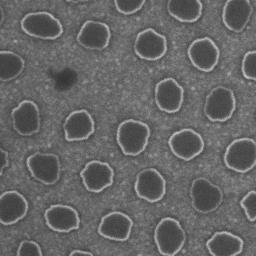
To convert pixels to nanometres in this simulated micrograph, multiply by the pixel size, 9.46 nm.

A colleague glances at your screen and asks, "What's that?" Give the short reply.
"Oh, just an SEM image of a regular array of raised bodies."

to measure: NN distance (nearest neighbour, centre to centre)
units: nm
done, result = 500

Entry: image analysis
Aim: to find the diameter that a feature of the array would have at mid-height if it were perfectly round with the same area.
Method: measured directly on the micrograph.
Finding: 298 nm